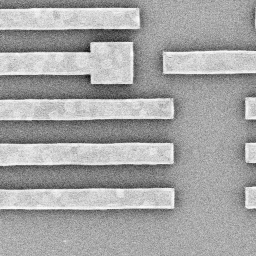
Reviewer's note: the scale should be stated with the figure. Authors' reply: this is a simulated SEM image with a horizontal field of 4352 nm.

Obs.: wiring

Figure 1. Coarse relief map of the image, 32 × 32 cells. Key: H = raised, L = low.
LLLLLLLLLLLLLLLLLLLLLLLLLLLLLLLL
HHHHHHHHHHHHHHHHHLLLLLLLLLLLLLLL
HHHHHHHHHHHHHHHHHLLLLLLLLLLLLLLL
HHHHHHHHHHHLLHHHHLLLLLLLLLLLLLLL
LLLLLLLLLLLLLLLLLLLLLLLLLLLLLLLL
LLLLLLLLLLLHHHHHLLLLLLLLLLLLLLLL
LLLLLLLLLLLHHHHHHLLLLLLLLHHHHHHH
HHHHHHHHHHHHHHHHHLLLHHHHHHHHHHHH
HHHHHHHHHHHHHHHHHLLLHHHHHHHHHHHH
LLLLLLLLLLLHHHHHHLLLLLLLLLLLLLLL
LLLLLLLLLLLLLLLLLLLLLLLLLLLLLLLL
LLLLLLLLLLLLLLLLLLLLLLLLLLLLLLLL
LLLHHHHHHHHHHHHHHHHHHLLLLLLLLLLH
HHHHHHHHHHHHHHHHHHHHHHLLLLLLLLLH
HHHHHHHHHHHHHHHHHHHHHHLLLLLLLLLH
LLLLLLLLLLLLLLLLLLLLLLLLLLLLLLLL
LLLLLLLLLLLLLLLLLLLLLLLLLLLLLLLL
LLLLLLLLLLLLLLLLLLLLLLLLLLLLLLLL
HHHHHHHHHHHHHHHHHHHHHHLLLLLLLLLH
HHHHHHHHHHHHHHHHHHHHHHLLLLLLLLLH
HHHHHHHHHHHHHHHHHHHHLLLLLLLLLLLL
LLLLLLLLLLLLLLLLLLLLLLLLLLLLLLLL
LLLLLLLLLLLLLLLLLLLLLLLLLLLLLLLL
LLLLLLLLLLLLLLLLLLLLLLLLLLLLLLLH
HHHHHHHHHHHHHHHHHHHHHHLLLLLLLLLH
HHHHHHHHHHHHHHHHHHHHHHLLLLLLLLLH
LLLLLLLLLLLLLLLLLLLLLLLLLLLLLLLL
LLLLLLLLLLLLLLLLLLLLLLLLLLLLLLLL
LLLLLLLLLLLLLLLLLLLLLLLLLLLLLLLL
LLLLLLLLLLLLLLLLLLLLLLLLLLLLLLLL
LLLLLLLLLLLLLLLLLLLLLLLLLLLLLLLL
LLLLLLLLLLLLLLLLLLLLLLLLLLLLLLLL